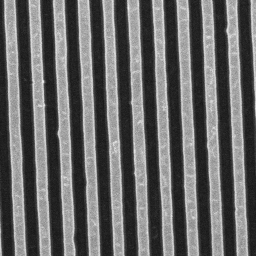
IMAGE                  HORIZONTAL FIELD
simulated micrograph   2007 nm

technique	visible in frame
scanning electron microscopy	parallel lines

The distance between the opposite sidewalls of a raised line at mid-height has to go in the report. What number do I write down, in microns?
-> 0.0969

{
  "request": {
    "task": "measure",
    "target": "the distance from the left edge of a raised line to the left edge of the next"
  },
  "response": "0.193 micrometres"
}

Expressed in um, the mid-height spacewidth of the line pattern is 0.0969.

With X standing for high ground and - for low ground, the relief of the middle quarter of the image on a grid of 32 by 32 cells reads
X---XXX---XXX----XX----XX----XXX
X---XXX---XXX----XX----XX----XXX
X---XXX---XXX----XXX---XXX---XXX
X---XXX---XXX----XXX---XXX---XXX
X---XXX---XXX----XXX---XXX---XXX
X---XXX---XXX----XXX---XXX---XXX
X---XXX---XXX----XXX---XXX---XXX
X---XXX---XXXX---XXX---XXX---XXX
X----XX----XXX---XXX---XXX---XXX
X----XX----XXX---XXX---XXX---XXX
X----XXX---XXX---XXX---XXX---XXX
X----XXX---XXX---XXX---XXX---XXX
X----XXX---XXX---XXX---XXX---XXX
X----XXX---XXX---XXX---XXX---XXX
XX---XXX---XXX---XXX---XXX---XXX
XX---XXX---XXX---XXX---XXX----XX
XX---XXX---XXX---XXX---XXX----XX
XX---XXX---XXX---XXX---XXX----XX
XX---XXX---XXX---XXX---XXX----XX
XX---XXX---XXX---XXX----XX----XX
XX---XXX---XXX---XXXX---XX----XX
XX---XXX---XXX---XXXX---XX----XX
XX---XXX---XXX----XX----XXX---XX
XX---XXX---XXX---XXX----XXX---XX
XX---XXX---XXX---XXX----XXX---XX
XX---XXX---XXX----XXX---XXX---XX
XX---XXX----XX----XXX---XXX---XX
XX---XXX----XX----XXX---XXX---XX
XX---XXX----XX----XXX---XXX---XX
XX---XXX---XXXX---XXX---XXX---XX
XX----XX---XXXX---XXX---XXX---XX
XX---XXX----XXX---XXX---XXX---XX